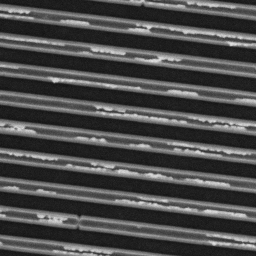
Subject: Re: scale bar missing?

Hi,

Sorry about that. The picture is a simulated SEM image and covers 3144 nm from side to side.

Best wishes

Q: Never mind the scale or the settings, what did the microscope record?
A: parallel lines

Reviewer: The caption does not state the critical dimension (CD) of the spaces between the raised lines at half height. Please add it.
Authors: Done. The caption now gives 221 nm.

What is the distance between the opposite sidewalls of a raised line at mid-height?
128 nanometers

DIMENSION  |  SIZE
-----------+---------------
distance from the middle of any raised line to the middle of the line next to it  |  28.6 pixels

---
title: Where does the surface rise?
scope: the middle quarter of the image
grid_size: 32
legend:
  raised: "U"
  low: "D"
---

DDDDDDDDDDDDDDDDDDDDDDDDDDDDUUUU
DDDDDDDDDDDDDDDDDDDDDDDDDDDDDDDD
UUUUDDDDDDDDDDDDDDDDDDDDDDDDDDDD
UUUUUUUUUUUUUUDDDDDDDDDDDDDDDDDD
DDUUUUUUUUUUUUUUUUUUDDDDDDDDDDDD
DDDDDDDDDDUUUUUUUUUUUUUUUUUUUUUD
DDDDDDDDDDDDDDDDDDDUUUUUUUUUUUUU
DDDDDDDDDDDDDDDDDDDDDDDDDDDUUUUU
DDDDDDDDDDDDDDDDDDDDDDDDDDDDDDDD
UUUDDDDDDDDDDDDDDDDDDDDDDDDDDDDD
UUUUUUUUUUUDDDDDDDDDDDDDDDDDDDDD
DUUUUUUUUUUUUUUUUUUDDDDDDDDDDDDD
DDDDDDDUUUUUUUUUUUUUUUUUUUUDDDDD
DDDDDDDDDDDDDDDDDUUUUUUUUUUUUUUU
DDDDDDDDDDDDDDDDDDDDDDDDDUUUUUUU
DDDDDDDDDDDDDDDDDDDDDDDDDDDDDDDD
UDDDDDDDDDDDDDDDDDDDDDDDDDDDDDDD
UUUUUUUUUUDDDDDDDDDDDDDDDDDDDDDD
UUUUUUUUUUUUUUUUUUDDDDDDDDDDDDDD
DDDDDDDDUUUUUUUUUUUUUUUUUUDDDDDD
DDDDDDDDDDDDDDUUUUUUUUUUUUUUUUUU
DDDDDDDDDDDDDDDDDDDDDDUUUUUUUUUU
DDDDDDDDDDDDDDDDDDDDDDDDDDDDDDUU
DDDDDDDDDDDDDDDDDDDDDDDDDDDDDDDD
UUUUUUUUDDDDDDDDDDDDDDDDDDDDDDDD
UUUUUUUUUUUUUUUUDDDDDDDDDDDDDDDD
DDDDUUUUUUUUUUUUUUUUUUUUUDDDDDDD
DDDDDDDDDDDDDUUUUUUUUUUUUUUUUUUU
DDDDDDDDDDDDDDDDDDDDDUUUUUUUUUUU
DDDDDDDDDDDDDDDDDDDDDDDDDDDDDUUU
DDDDDDDDDDDDDDDDDDDDDDDDDDDDDDDD
UUUUUUUDDDDDDDDDDDDDDDDDDDDDDDDD